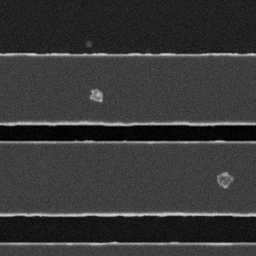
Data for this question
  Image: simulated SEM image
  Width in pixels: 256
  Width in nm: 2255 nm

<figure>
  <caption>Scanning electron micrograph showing lines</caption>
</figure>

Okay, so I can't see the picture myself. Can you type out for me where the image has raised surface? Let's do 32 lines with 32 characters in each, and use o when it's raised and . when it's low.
................................
................................
................................
................................
................................
................................
................................
oooooooooooooooooooooooooooooooo
oooooooooooooooooooooooooooooooo
oooooooooooooooooooooooooooooooo
oooooooooooooooooooooooooooooooo
oooooooooooooooooooooooooooooooo
oooooooooooooooooooooooooooooooo
oooooooooooooooooooooooooooooooo
oooooooooooooooooooooooooooooooo
oooooooooooooooooooooooooooooooo
................................
................................
oooooooooooooooooooooooooooooooo
oooooooooooooooooooooooooooooooo
oooooooooooooooooooooooooooooooo
oooooooooooooooooooooooooooooooo
oooooooooooooooooooooooooooooooo
oooooooooooooooooooooooooooooooo
oooooooooooooooooooooooooooooooo
oooooooooooooooooooooooooooooooo
oooooooooooooooooooooooooooooooo
................................
................................
................................
oooooooooooooooooooooooooooooooo
oooooooooooooooooooooooooooooooo